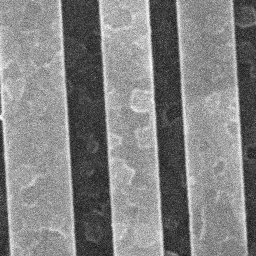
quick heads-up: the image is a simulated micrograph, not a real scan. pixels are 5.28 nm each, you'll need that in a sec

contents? one or a few lines or trenches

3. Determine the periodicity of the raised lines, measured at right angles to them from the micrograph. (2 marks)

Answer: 84.9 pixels